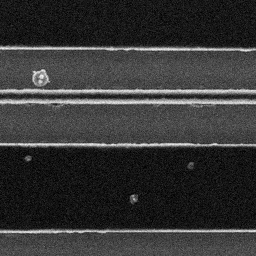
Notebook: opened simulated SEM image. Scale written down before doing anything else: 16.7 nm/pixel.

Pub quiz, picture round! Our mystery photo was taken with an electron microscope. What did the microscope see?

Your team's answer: lines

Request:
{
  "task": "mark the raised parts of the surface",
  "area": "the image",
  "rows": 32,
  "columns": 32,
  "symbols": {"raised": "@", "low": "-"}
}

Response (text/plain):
@@@@@@@@@@@@@@@@@@@@@@@@@@@@@@@@
@@@@@@@@@@@@@@@@@@@@@@@@@@@@@@@@
@@@@@@@@@@@@@@@@@@@@@@@@@@@@@@@@
@@@@@@@@@@@@@@@@@@@@@@@@@@@@@@@@
@@@@@@@@@@@@@@@@@@@@@@@@@@@@@@@@
@@@@@@@@@@@@@@@@@@@@@@@@@@@@@@@@
--------------------------------
--------------------------------
--------------------------------
--------------------------------
--------------------------------
@@@@@@@@@@@@@@@@@@@@@@@@@@@@@@@@
@@@@@@@@@@@@@@@@@@@@@@@@@@@@@@@@
--------------------------------
--------------------------------
--------------------------------
--------------------------------
--------------------------------
@@@@@@@@@@@@@@@@@@@@@@@@@@@@@@@@
@@@@@@@@@@@@@@@@@@@@@@@@@@@@@@@@
@@@@@@@@@@@@@@@@@@@@@@@@@@@@@@@@
@@@@@@@@@@@@@@@@@@@@@@@@@@@@@@@@
@@@@@@@@@@@@@@@@@@@@@@@@@@@@@@@@
@@@@@@@@@@@@@@@@@@@@@@@@@@@@@@@@
@@@@@@@@@@@@@@@@@@@@@@@@@@@@@@@@
@@@@@@@@@@@@@@@@@@@@@@@@@@@@@@@@
@@@@@@@@@@@@@@@@@@@@@@@@@@@@@@@@
@@@@@@@@@@@@@@@@@@@@@@@@@@@@@@@@
@@@@@@@@@@@@@@@@@@@@@@@@@@@@@@@@
--------------------------------
--------------------------------
--------------------------------